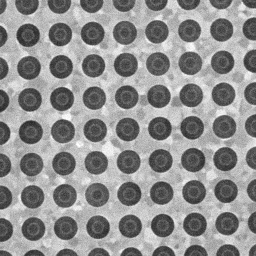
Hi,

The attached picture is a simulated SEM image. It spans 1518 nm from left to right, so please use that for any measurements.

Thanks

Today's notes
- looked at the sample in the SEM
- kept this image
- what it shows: an array of small figures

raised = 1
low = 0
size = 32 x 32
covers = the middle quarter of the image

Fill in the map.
00110000001100000001000000011000
00111000001110000011100000111000
00111000001110000011110001111100
11111100111111111111111111111111
11111111111111111111111111111111
11111110111111000111110001111100
00111000001110000011100000111000
00111000001110000001100000011000
00011000000110000001100000011000
00111000001110000011100000111000
00111000001111000011110000110100
01111110111111111111111111110111
11111111111111111111111111111110
11111111111111100111010000111100
00111100001111000010000000011000
00011000000110000001100000011000
00011000000110000001100000011000
00011000000110000001100000011000
00111000001111000011110000111000
01111110010111111111111111111111
11111111111111111111111111111111
11000111111111100111101000111100
00111100001111000011100000011100
00011000000110000001100000011000
00011000000110000001100000011000
00011000000110000001100000011000
00011100000111000011110000111100
00111110011111100111111111111111
11111111111111111111111011111111
11110011111111100111111000111110
00111100001111000001110000011100
00011000000110000001110000011000